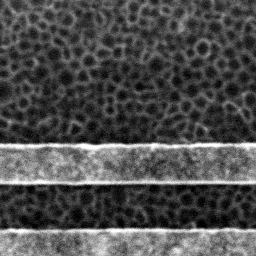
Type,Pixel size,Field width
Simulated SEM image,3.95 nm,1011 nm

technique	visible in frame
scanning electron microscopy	one or a few lines or trenches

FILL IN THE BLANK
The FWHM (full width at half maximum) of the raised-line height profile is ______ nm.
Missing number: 149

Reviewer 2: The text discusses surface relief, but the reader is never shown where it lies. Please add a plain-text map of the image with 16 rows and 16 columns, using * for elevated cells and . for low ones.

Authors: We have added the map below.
................
................
................
................
................
................
................
................
................
****************
****************
................
................
................
****************
****************